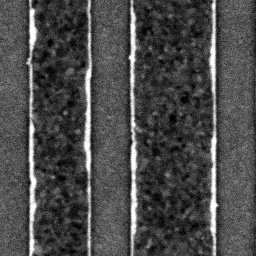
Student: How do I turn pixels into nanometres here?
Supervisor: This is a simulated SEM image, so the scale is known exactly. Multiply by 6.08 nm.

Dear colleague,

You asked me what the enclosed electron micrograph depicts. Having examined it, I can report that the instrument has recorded one or a few lines or trenches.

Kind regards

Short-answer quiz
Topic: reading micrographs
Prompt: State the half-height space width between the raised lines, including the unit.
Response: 255 nm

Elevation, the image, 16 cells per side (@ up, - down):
--@@@@--@@@@@---
--@@@@--@@@@@---
--@@@@--@@@@@---
--@@@@--@@@@@---
--@@@@--@@@@@---
--@@@@--@@@@@---
--@@@@--@@@@@---
--@@@@--@@@@@---
--@@@@--@@@@@---
--@@@@--@@@@@---
--@@@@--@@@@@---
--@@@@--@@@@@---
--@@@@--@@@@@---
--@@@@--@@@@@---
--@@@@--@@@@@---
--@@@@--@@@@@---